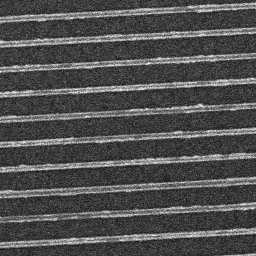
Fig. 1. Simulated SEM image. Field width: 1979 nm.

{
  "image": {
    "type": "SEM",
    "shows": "parallel lines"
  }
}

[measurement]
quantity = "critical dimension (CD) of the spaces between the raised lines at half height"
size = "0.15 µm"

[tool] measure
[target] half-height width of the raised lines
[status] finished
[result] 0.0405 um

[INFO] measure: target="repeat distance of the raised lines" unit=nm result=193